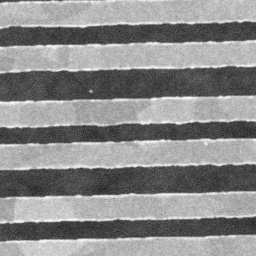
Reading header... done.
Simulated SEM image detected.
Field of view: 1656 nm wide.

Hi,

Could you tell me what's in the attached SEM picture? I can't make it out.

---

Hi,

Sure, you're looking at lines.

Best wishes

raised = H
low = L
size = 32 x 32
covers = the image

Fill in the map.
HHHHHHHHHHHHHHHHHHHHHHHHHHHHHHHH
HHHHHHHHHHHHHHHHHHHHHHHHHHHHHHHH
HHHHHHHHHHHHHHHHHHHHHHHHHHHHHHHH
LLLLLLLLLLLLLLLLLLLLLLLLLLLLLLLL
LLLLLLLLLLLLLLLLLLLLLLLLLLLLLLLL
LLLLLLLLLLLLLLLLHHHHHHHHHHHHHHHH
HHHHHHHHHHHHHHHHHHHHHHHHHHHHHHHH
HHHHHHHHHHHHHHHHHHHHHHHHHHHHHHHH
HHHHHHHHHHHHHHHHHLLLLLLLLLLLLLLL
LLLLLLLLLLLLLLLLLLLLLLLLLLLLLLLL
LLLLLLLLLLLLLLLLLLLLLLLLLLLLLLLL
LLLLLLLLLLLLLLLLLLLLLLLLLLLLLLLL
LLLLLLLLLLLLLLHHHHHHHHHHHHHHHHHH
HHHHHHHHHHHHHHHHHHHHHHHHHHHHHHHH
HHHHHHHHHHHHHHHHHHHHHHHHHHHHHHHH
HHHHHHHHHHHHHHHLLLLLLLLLLLLLLLLL
LLLLLLLLLLLLLLLLLLLLLLLLLLLLLLLL
LLLLLLLLLLLLLLLLLLLLLLLLLHHLHHHH
HHHHHHHHHHHHHHHHHHHHHHHHHHHHHHHH
HHHHHHHHHHHHHHHHHHHHHHHHHHHHHHHH
HHHHHHHHHHHHHHHHHHHHHHHHHHHHLHLL
LLLLLLLLLLLLLLLLLLLLLLLLLLLLLLLL
LLLLLLLLLLLLLLLLLLLLLLLLLLLLLLLL
LLLLLLLLLLLLLLLLLLLLLLLLLLLLLLLL
LLLLLLLLLLLLLLLHHHHHHHHHHHHHHHHH
HHHHHHHHHHHHHHHHHHHHHHHHHHHHHHHH
HHHHHHHHHHHHHHHHHHHHHHHHHHHHHHHH
HHHHHHHHHHHHHHLLHLLLLLLLLLLLLLLL
LLLLLLLLLLLLLLLLLLLLLLLLLLLLLLLL
LLLLLLLLLLLLLLLLLLLLLLLLLLLLHHHH
HHHHHHHHHHHHHHHHHHHHHHHHHHHHHHHH
HHHHHHHHHHHHHHHHHHHHHHHHHHHHHHHH